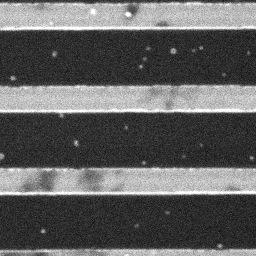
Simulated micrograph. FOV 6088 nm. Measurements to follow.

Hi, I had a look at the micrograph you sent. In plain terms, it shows lines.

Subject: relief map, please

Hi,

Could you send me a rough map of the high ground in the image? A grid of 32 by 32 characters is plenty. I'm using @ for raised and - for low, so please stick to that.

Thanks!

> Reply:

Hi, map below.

-@@@@-@@@@@@@@@@-@@@-------@@---
--------------------------------
--------------------------------
--------------------------------
@@@@@@@@@@@@@@@@@@@@@@@@@@@@@@@@
@@@@@@@@@@@@@@@@@@@@@@@@@@@@@@@@
@@@@@@@@@@@@@@@@@@@@@@@@@@@@@@@@
@@@@@@@@@@@@@@@@@@@@@@@@@@@@@@@@
@@@@@@@@@@@@@@@@@@@@@@@@@@@@@@@@
@@@@@@@@@@@@@@@@@@@@@@@@@@@@@@@@
@@@@@@@@@@@@@@@@@@@@@@@@@@@@@@@@
--------------------------------
--------------------------------
--------------------------------
@@@@@@@@@@@@@@@@@@@@@@@@@@@@@@@@
@@@@@@@@@@@@@@@@@@@@@@@@@@@@@@@@
@@@@@@@@@@@@@@@@@@@@@@@@@@@@@@@@
@@@@@@@@@@@@@@@@@@@@@@@@@@@@@@@@
@@@@@@@@@@@@@@@@@@@@@@@@@@@@@@@@
@@@@@@@@@@@@@@@@@@@@@@@@@@@@@@@@
@@@@@@@@@@@@@@@@@@@@@@@@@@@@@@@@
--------------------------------
--------------------------------
--------------------------------
@@@@@@@@@@@@@@@@@@@@@@@@@@@@@@@@
@@@@@@@@@@@@@@@@@@@@@@@@@@@@@@@@
@@@@@@@@@@@@@@@@@@@@@@@@@@@@@@@@
@@@@@@@@@@@@@@@@@@@@@@@@@@@@@@@@
@@@@@@@@@@@@@@@@@@@@@@@@@@@@@@@@
@@@@@@@@@@@@@@@@@@@@@@@@@@@@@@@@
@@@@@@@@@@@@@@@@@@@@@@@@@@@@@@@@
--------------------------------